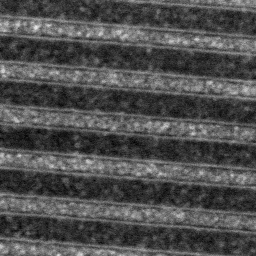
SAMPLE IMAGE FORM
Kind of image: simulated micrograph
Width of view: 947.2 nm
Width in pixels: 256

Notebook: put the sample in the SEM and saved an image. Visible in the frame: parallel lines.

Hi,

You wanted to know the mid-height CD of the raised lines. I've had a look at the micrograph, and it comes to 103 nanometres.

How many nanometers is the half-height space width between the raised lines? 59.5